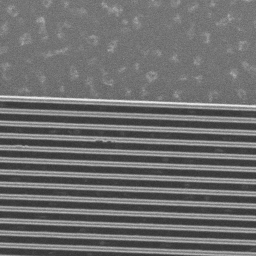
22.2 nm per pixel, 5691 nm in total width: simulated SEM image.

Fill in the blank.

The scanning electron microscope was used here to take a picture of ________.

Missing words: parallel lines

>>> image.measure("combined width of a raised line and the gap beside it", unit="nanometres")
271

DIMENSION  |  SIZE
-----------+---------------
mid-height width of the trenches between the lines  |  155 nm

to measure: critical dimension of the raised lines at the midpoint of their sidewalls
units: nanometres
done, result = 117